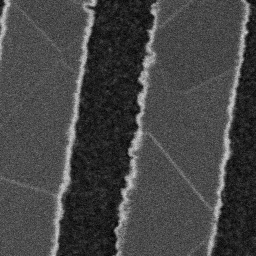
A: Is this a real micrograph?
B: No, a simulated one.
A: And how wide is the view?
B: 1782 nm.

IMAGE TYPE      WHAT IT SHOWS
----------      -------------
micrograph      one or a few lines or trenches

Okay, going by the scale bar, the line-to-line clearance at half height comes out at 439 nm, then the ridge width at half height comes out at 628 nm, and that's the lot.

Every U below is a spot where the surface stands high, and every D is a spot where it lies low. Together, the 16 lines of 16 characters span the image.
UUUUUUDDDDUUUUUD
UUUUUUDDDDUUUUUD
UUUUUDDDDUUUUUUD
UUUUUDDDDUUUUUUD
UUUUUDDDDUUUUUUD
UUUUUDDDDUUUUUUD
UUUUUDDDDUUUUUDD
UUUUUDDDDUUUUUDD
UUUUDDDDDUUUUUDD
UUUUDDDDUUUUUUDD
UUUUDDDDUUUUUUDD
UUUUDDDDUUUUUUDD
UUUUDDDDUUUUUUDD
UUUUDDDDUUUUUUDD
UUUUDDDUUUUUUDDD
UUUDDDDUUUUUUDDD